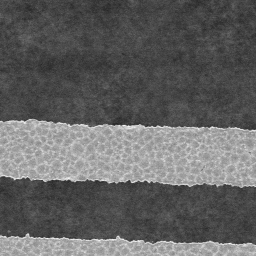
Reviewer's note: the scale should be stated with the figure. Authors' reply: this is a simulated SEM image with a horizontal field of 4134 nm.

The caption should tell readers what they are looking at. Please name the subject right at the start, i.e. one or a few lines or trenches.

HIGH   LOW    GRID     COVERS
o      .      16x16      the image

................
................
................
................
................
................
................
................
oooooooooooooooo
oooooooooooooooo
oooooooooooooooo
..........o.oooo
................
................
................
oooooooooooooooo